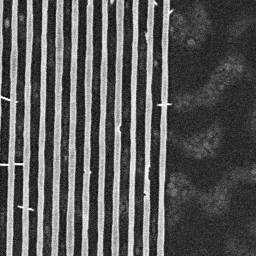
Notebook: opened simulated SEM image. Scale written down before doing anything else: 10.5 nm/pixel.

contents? parallel lines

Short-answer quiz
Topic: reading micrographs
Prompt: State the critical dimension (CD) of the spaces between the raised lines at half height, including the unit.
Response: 101 nanometers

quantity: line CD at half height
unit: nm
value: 56.5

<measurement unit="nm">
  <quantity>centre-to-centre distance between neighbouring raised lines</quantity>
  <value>159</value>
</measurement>